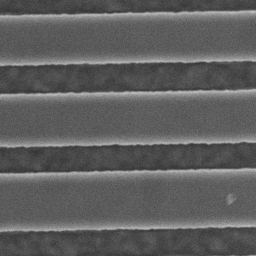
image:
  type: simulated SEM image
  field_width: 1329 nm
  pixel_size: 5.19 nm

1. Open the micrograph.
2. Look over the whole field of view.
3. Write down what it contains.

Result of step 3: lines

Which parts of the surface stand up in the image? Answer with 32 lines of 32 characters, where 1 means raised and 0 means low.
00000000000000000000000000000000
00000000000000000000000011111111
11111111111111111111111111111111
11111111111111111111111111111111
11111111111111111111111111111111
11111111111111111111111111111111
11111111111111111111111111111111
11111111111111111111111111111111
00000000000000000000000000000000
00000000000000000000000000000000
00000000000000000000000000000000
00000000000000111111111111111111
11111111111111111111111111111111
11111111111111111111111111111111
11111111111111111111111111111111
11111111111111111111111111111111
11111111111111111111111111111111
11111111111111111111111111111111
00000000000000000000000000000000
00000000000000000000000000000000
00000000000000000000000000000000
00000000000001111111111111111111
11111111111111111111111111111111
11111111111111111111111111111111
11111111111111111111111111111111
11111111111111111111111111111111
11111111111111111111111111111111
11111111111111111111111111111111
11111111111111111111111110000000
00000000000000000000000000000000
00000000000000000000000000000000
00000000000000000000000000000000